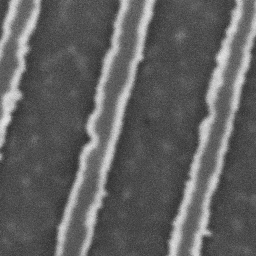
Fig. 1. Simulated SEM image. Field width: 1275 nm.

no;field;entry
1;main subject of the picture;one or a few lines or trenches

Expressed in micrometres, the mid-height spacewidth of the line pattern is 0.41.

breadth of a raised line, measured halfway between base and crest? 136 nanometres